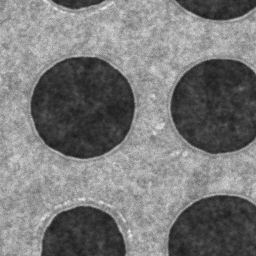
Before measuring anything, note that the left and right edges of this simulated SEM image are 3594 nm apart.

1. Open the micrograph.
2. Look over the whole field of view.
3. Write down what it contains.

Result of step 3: holes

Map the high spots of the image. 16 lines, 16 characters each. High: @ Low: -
@@@@-@@@@@@@----
@@@@@@@@@@@@@@@@
@@@@@@@@@@@@@@@@
@@@@@@@@@@@@@@@@
@@@----@@@@@----
@@------@@@-----
@@------@@@-----
@@------@@@-----
@@------@@@-----
@@@@---@@@@@@--@
@@@@@@@@@@@@@@@@
@@@@@@@@@@@@@@@@
@@@@@@@@@@@@---@
@@@----@@@@-----
@@@-----@@@-----
@@@-----@@------